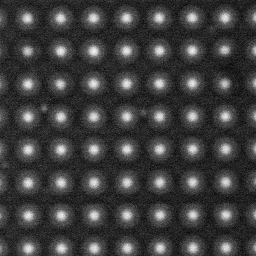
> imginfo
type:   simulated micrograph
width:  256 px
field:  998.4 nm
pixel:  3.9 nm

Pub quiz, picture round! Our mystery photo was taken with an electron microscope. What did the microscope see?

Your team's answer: an array of small figures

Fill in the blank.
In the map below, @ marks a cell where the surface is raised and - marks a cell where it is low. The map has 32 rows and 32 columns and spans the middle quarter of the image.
--------------------------------
--------------------------------
@-----@@@-----@@@-----@@@@----@@
@@---@@@@@---@@@@@---@@@@@----@@
@@--@@@@@@---@@@@@@--@@@@@@--@@@
@@--@@@@@@---@@@@@@--@@@@@@--@@@
@@---@@@@@---@@@@@---@@@@@----@@
@-----@@@-----@@@-----@@@------@
--------------------------------
--------------------------------
------@@@-----@@@------@@------@
@@---@@@@@---@@@@@---@@@@@----@@
@@---@@@@@---@@@@@@--@@@@@@--@@@
@@---@@@@@---@@@@@@--@@@@@@--@@@
@@---@@@@@---@@@@@---@@@@@@---@@
@----@@@@-----@@@@----@@@@----@@
--------------------------------
--------------------------------
-----------------------@@------@
@----@@@@@---@@@@@----@@@@----@@
@@---@@@@@---@@@@@@--@@@@@@--@@@
@@---@@@@@---@@@@@@--@@@@@@--@@@
@@---@@@@@---@@@@@---@@@@@@--@@@
@----@@@@@----@@@@----@@@@----@@
--------------------------------
--------------------------------
--------------------------------
@----@@@@@----@@@@----@@@@----@@
@@---@@@@@---@@@@@---@@@@@@--@@@
@@---@@@@@---@@@@@@--@@@@@@--@@@
@@---@@@@@---@@@@@@--@@@@@@--@@@
@@---@@@@@---@@@@@----@@@@----@@